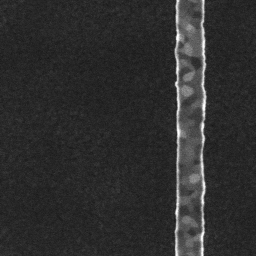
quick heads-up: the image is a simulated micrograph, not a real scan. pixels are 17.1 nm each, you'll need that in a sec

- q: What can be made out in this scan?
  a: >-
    one or a few lines or trenches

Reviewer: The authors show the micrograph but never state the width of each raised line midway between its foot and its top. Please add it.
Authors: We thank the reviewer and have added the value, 460 nm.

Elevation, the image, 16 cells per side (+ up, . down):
...........++...
...........++...
...........++...
...........++...
...........++...
...........++...
...........++...
...........++...
...........++...
...........++...
...........++...
...........++...
...........++...
...........++...
...........++...
...........++...